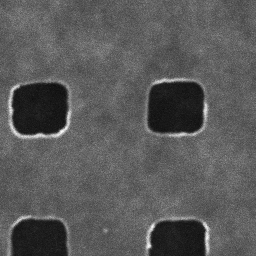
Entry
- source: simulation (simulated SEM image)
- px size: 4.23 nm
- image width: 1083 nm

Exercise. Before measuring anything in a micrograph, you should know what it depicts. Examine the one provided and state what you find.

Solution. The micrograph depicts holes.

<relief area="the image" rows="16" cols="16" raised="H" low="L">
HHHHHHHHHHHHHHHH
HHHHHHHHHHHHHHHH
HHHHHHHHHHHHHHHH
HHHHHHHHHHHHHHHH
HHHHHHHHHHHHHHHH
HLLLHHHHHHLLLHHH
HLLLHHHHHLLLLHHH
HLLLHHHHHLLLLHHH
HHHHHHHHHHHHHHHH
HHHHHHHHHHHHHHHH
HHHHHHHHHHHHHHHH
HHHHHHHHHHHHHHHH
HHHHHHHHHHHHHHHH
HHHHHHHHHHHHHHHH
HLLLHHHHHHLLLHHH
HLLLHHHHHLLLLHHH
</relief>